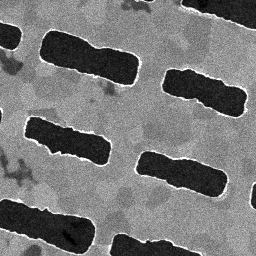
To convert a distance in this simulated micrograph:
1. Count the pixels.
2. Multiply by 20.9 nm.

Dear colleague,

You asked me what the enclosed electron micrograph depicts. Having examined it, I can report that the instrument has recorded holes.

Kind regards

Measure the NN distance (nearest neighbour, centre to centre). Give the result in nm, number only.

1780